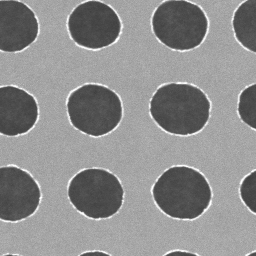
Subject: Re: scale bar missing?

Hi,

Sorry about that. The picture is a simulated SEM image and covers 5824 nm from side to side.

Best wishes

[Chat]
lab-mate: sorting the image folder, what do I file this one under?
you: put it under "holes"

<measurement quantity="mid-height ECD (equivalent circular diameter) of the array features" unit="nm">1200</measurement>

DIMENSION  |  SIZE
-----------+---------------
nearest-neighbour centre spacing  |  1920 nm